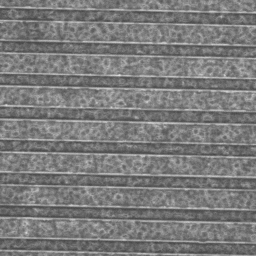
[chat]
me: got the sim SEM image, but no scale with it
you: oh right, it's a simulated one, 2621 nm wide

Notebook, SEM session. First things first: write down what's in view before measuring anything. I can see parallel lines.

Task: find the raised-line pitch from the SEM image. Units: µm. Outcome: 0.337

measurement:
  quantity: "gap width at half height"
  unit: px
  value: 12.4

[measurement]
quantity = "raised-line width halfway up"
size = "206 nm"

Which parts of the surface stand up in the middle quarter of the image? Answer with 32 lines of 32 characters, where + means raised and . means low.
++++++++++++++++++++++++++++++++
++++++++++++++++++++++++++++++++
++++++++++++++++++++++++++++++++
................................
................................
................................
+++++++++++++++++++++++++.......
++++++++++++++++++++++++++++++++
++++++++++++++++++++++++++++++++
++++++++++++++++++++++++++++++++
++++++++++++++++++++++++++++++++
................................
................................
................................
+++++++++.......................
++++++++++++++++++++++++++++++++
++++++++++++++++++++++++++++++++
++++++++++++++++++++++++++++++++
++++++++++++++++++++++++++++++++
...................+++++++++++++
................................
................................
++++............................
++++++++++++++++++++++++++++++++
++++++++++++++++++++++++++++++++
++++++++++++++++++++++++++++++++
++++++++++++++++++++++++++++++++
.............+++++++++++++++++++
................................
................................
................................
++++++++++++++++++++++++++++++++